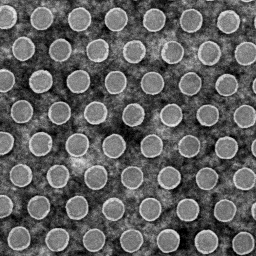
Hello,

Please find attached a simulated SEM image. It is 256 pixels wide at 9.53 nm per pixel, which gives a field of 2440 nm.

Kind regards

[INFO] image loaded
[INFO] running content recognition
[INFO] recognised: a regular array of raised bodies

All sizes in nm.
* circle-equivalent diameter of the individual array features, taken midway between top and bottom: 209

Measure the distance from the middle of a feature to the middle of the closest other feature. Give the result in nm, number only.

344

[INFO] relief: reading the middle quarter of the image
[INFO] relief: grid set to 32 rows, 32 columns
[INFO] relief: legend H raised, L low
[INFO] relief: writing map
LLLLLLLLLLLLLLLLLLLLLLLLLLLLLLLL
LLLLLLLLLLLLLLLLLLLLLLLLLLLLLLLL
LLHHHHLLLLLHHHHLLLLLLHHLLLLLLLLH
LHHHHHLLLLLHHHHLLLLLHHHHHLLLLLHH
LHHHHHLLLLHHHHHLLLLLHHHHHLLLLHHH
LHHHHHLLLLLHHHHLLLLLHHHHHLLLLHHH
LLHHHLLLLLLHHHHLLLLLHHHHLLLLLHHH
LLLLLLLLLLLLLLLLLLLLLLLLLLLLLLHH
LLLLLLLLLLLLLLLLLLLLLLLLLLLLLLLL
LLLLLLLLLLLLLLLLLLLLLLLLLLLLLLLL
HLLLLLHHHHLLLLLLHHHLLLLLLLHHLLLL
HLLLLLHHHHLLLLLHHHHHLLLLLHHHHLLL
HLLLLHHHHHHLLLLHHHHHLLLLHHHHHLLL
HLLLLHHHHHLLLLLHHHHHLLLLHHHHHLLL
LLLLLLHHHLLLLLLHHHHLLLLLLHHHHLLL
LLLLLLLLLLLLLLLLLLLLLLLLLLLLLLLL
LLLLLLLLLLLLLLLLLLLLLLLLLLLLLLLL
LLLLLLLLLLLLLLLLLLLLLLLLLLLLLLLL
LHHHHHLLLLLHHHHLLLLLHHHHLLLLLLHH
LHHHHHLLLLHHHHHLLLLLHHHHHLLLLHHH
LHHHHHLLLLHHHHHLLLLHHHHHLLLLLHHH
LHHHHHLLLLHHHHHLLLLHHHHHLLLLLHHH
LLHHHLLLLLLHHHLLLLLLHHHHLLLLLHHH
LLLLLLLLLLLLLLLLLLLLLLLLLLLLLLLL
LLLLLLLLLLLLLLLLLLLLLLLLLLLLLLLL
LLLLLLLLLLLLLLLLLLLLLLLLLLLLLLLL
HLLLLLHHHHLLLLLHHHHLLLLLLHHHLLLL
HLLLLHHHHHHLLLHHHHHHLLLLHHHHHLLL
HLLLLHHHHHHLLLHHHHHHLLLLHHHHHLLL
HLLLLHHHHHLLLLLHHHHLLLLLHHHHHLLL
LLLLLLHHHHLLLLLLHHHLLLLLLHHHLLLL
LLLLLLLLLLLLLLLLLLLLLLLLLLLLLLLL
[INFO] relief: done